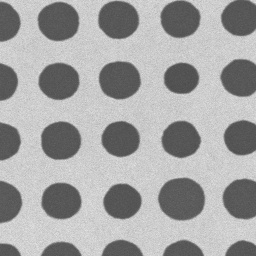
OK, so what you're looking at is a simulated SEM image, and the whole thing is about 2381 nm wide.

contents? a regular array of holes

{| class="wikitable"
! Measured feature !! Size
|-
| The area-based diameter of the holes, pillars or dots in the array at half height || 0.364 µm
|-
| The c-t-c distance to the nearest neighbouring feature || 555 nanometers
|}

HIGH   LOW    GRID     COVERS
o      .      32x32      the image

.ooooo..ooooo...ooooo...ooooo...
..ooo.....oo.....ooo.....ooo....
...oo.....oo.....ooo.....ooo....
..ooo.....ooo....ooo.....ooo....
..oooo...ooooo..oooooo..oooooooo
oooooooooooooooooooooooooooooooo
oooooooooooooooooooooooooooooooo
ooooooooooooooooooooooooooooo..o
.ooooo...oooo....oooo...oooo....
..ooo.....oo.....oooo....ooo....
..ooo.....oo......ooo....ooo....
..ooo....oooo....ooooo..ooooo...
.ooooooooooooooooooooooooooooooo
oooooooooooooooooooooooooooooooo
oooooooooooooooooooooooooooooooo
.ooooo...ooooo..ooooo...ooooo...
..ooo.....ooo....ooo.....ooo....
...oo.....ooo....ooo.....ooo....
..ooo.....ooo....ooo.....ooo....
..oooo...ooooo..oooooo..oooooooo
oooooooooooooooooooooooooooooooo
oooooooooooooooooooooooooooooooo
ooooooooooooooooooooo...ooooo...
..oooo...ooooo...ooo.....ooo....
...oo.....ooo.....oo......oo....
...oo.....ooo.....oo......oo....
..oooo....ooo....ooo.....oooo...
.ooooooooooooooooooooo..oooooooo
oooooooooooooooooooooooooooooooo
oooooooooooooooooooooooooooooooo
.ooooo...ooooo...oooo...ooooo...
..ooo.....ooo.....oo.....ooo....